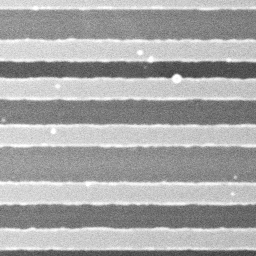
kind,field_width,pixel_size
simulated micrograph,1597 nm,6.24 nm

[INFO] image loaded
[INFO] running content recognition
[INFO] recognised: lines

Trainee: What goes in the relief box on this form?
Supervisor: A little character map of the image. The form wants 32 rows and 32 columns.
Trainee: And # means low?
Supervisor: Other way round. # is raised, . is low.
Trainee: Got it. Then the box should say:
################################
................................
................................
................................
................................
################################
################################
################################
................................
................................
################################
################################
................................
................................
................................
................................
################################
################################
................................
................................
................................
................................
................................
################################
################################
#####...##.#######.#############
................................
................................
................................
################################
################################
................................